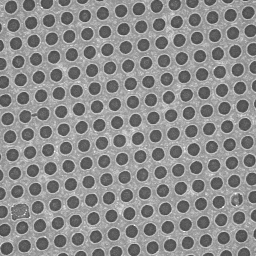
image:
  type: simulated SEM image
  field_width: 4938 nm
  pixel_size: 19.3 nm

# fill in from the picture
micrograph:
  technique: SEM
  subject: a regular array of holes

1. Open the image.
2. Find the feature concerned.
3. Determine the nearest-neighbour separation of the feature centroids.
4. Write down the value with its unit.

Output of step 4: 345 nm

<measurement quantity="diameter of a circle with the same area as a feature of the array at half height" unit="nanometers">251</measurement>